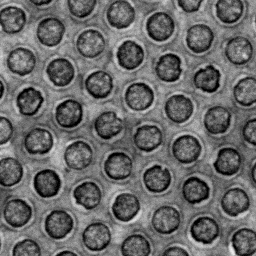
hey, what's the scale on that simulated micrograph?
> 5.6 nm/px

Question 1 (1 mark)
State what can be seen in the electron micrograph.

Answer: a regular array of holes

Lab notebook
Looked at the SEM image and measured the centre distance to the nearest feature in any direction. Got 227 nm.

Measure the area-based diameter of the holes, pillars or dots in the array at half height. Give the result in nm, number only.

158